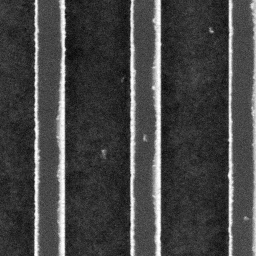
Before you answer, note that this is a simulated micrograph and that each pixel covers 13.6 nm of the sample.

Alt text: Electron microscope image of lines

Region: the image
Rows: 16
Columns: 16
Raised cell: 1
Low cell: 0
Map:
0011000011000011
0011000011000011
0011000011000011
0011000011000011
0011000011000011
0011000011000011
0011000011000011
0011000011000011
0011000011000011
0011000011000011
0011000011000011
0011000011000011
0011000011000011
0011000011000011
0011000011000011
0011000011000011